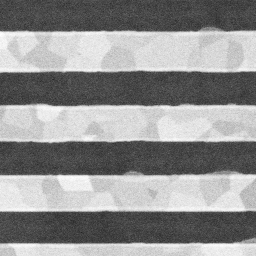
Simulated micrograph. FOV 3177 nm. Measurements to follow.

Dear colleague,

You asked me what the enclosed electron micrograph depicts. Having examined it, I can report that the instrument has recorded lines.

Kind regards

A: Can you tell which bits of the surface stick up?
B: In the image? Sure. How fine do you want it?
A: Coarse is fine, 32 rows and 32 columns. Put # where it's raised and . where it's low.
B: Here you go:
................................
................................
................................
................................
################################
################################
################################
################################
################################
................................
................................
................................
................................
################################
################################
################################
################################
#################.##############
................................
................................
................................
................................
################################
################################
################################
################################
................................
................................
................................
................................
................##......#.......
################################